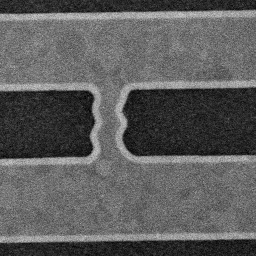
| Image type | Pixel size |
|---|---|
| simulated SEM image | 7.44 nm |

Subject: one or a few lines or trenches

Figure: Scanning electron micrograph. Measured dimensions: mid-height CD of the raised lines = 579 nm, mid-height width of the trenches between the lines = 546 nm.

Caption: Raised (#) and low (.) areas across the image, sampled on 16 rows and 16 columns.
................
################
################
################
################
.....###........
......##........
......##........
......##........
......##........
################
################
################
################
################
................